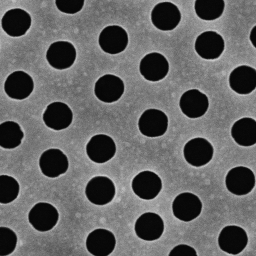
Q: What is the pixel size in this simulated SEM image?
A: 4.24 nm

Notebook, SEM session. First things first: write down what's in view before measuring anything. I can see a regular array of holes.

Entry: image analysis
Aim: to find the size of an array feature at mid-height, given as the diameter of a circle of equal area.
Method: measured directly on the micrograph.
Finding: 122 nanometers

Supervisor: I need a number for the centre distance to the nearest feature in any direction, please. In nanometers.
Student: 206